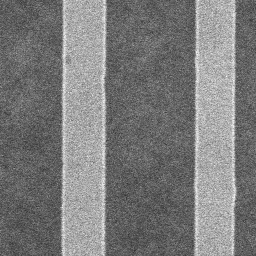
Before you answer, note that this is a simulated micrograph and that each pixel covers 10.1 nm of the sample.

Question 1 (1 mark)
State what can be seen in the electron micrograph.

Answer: one or a few lines or trenches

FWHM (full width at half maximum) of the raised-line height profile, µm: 0.389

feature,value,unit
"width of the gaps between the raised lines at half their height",942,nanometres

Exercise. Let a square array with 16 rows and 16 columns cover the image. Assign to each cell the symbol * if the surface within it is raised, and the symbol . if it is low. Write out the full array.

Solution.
....**......***.
....**......***.
....**......***.
....**......***.
....**......***.
....**......***.
....**......***.
....**......***.
....**......***.
....**......***.
....**......***.
....**......***.
....**......***.
....**......***.
....**......***.
....**......***.